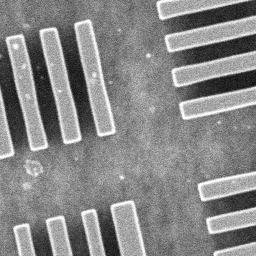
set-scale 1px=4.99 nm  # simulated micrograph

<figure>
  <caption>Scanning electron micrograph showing groups of lines, slits or small figures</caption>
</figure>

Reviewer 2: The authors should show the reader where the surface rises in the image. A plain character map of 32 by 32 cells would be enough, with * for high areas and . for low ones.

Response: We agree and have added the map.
....................*********...
....................****........
..............................**
.........**..............*******
.....**...**.........**********.
.**..***..**.........*****......
.**..***..**...................*
.***..**..**...............*****
..**..**..***.........**********
..**..**...**.........******....
..**..***..**.........**........
..**...**..**................***
..***..**..**...........********
*..**..**..***.........*******..
*..**..***..**.........**.......
*..**...**..**..................
*..***..**..**..................
*...**..**......................
**..*...........................
*...............................
................................
................................
...........................*****
.........................*******
.........................***....
...............**...............
...........*..***.............**
......**..**..***.........******
..**..**...*..***.........****..
..**..**...**..***..............
..**..***..**..***.............*
..**...**..**..***.........*****